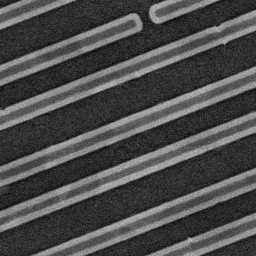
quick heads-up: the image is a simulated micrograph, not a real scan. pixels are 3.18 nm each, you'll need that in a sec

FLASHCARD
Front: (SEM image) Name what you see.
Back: parallel lines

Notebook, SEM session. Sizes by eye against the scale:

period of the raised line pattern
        47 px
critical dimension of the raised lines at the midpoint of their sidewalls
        46.3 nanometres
